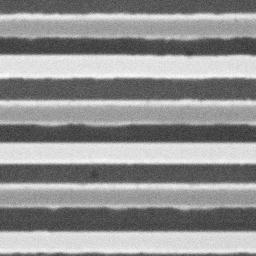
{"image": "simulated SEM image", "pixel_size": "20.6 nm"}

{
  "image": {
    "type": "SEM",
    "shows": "lines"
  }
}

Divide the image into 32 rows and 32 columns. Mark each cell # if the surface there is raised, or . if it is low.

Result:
................................
................................
################################
################################
################################
................................
................................
################################
################################
################################
................................
................................
................................
################################
################################
........................##......
................................
................................
################################
################################
................................
................................
................................
################################
################################
################################
................................
................................
................................
################################
################################
................................